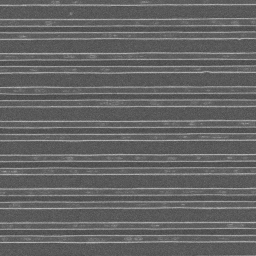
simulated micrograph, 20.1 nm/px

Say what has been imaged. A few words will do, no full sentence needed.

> parallel lines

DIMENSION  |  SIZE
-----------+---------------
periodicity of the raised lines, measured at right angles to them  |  334 nanometres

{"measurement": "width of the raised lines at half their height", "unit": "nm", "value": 140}